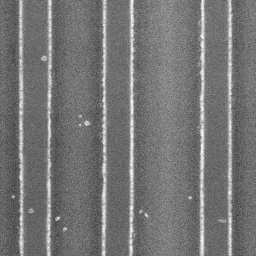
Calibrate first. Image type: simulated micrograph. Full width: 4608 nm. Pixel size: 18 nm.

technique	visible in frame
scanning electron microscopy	lines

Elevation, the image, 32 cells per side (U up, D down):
DDDUUUDDDDDDDUUUUDDDDDDDDUUUUDDD
DDDUUUDDDDDDDUUUUDDDDDDDDUUUUDDD
DDDUUUDDDDDDDUUUUDDDDDDDDUUUUDDD
DDDUUUDDDDDDDUUUUDDDDDDDDUUUUDDD
DDDUUUDDDDDDDUUUUDDDDDDDDUUUUDDD
DDDUUUDDDDDDDUUUUDDDDDDDDUUUUDDD
DDDUUUDDDDDDDUUUUDDDDDDDDUUUUDDD
DDDUUUDDDDDDDUUUUDDDDDDDDUUUUDDD
DDDUUUDDDDDDDUUUUDDDDDDDDUUUUDDD
DDDUUUDDDDDDDUUUUDDDDDDDDUUUUDDD
DDDUUUDDDDDDDUUUUDDDDDDDDUUUUDDD
DDDUUUDDDDDDDUUUUDDDDDDDDUUUUDDD
DDDUUUDDDDDDDUUUUDDDDDDDDUUUUDDD
DDDUUUDDDDDDDUUUUDDDDDDDDUUUUDDD
DDDUUUDDDDDDDUUUUDDDDDDDDUUUUDDD
DDDUUUDDDDDDDUUUUDDDDDDDDUUUUDDD
DDDUUUDDDDDDDUUUUDDDDDDDDUUUUDDD
DDDUUUDDDDDDDUUUUDDDDDDDDUUUUDDD
DDDUUUDDDDDDDUUUUDDDDDDDDUUUUDDD
DDDUUUDDDDDDDUUUUDDDDDDDDUUUUDDD
DDDUUUDDDDDDDUUUDDDDDDDDDUUUUDDD
DDDUUUDDDDDDDUUUDDDDDDDDDUUUUDDD
DDDUUUDDDDDDDUUUUDDDDDDDDUUUUDDD
DDDUUUDDDDDDDUUUUDDDDDDDDUUUUDDD
DDDUUUDDDDDDDUUUUDDDDDDDDUUUUDDD
DDDUUUDDDDDDDUUUUDDDDDDDDUUUUDDD
DDDUUUDDDDDDDUUUDDDDDDDDDUUUUDDD
DDDUUUDDDDDDDUUUDDDDDDDDDUUUUDDD
DDDUUUDDDDDDDUUUDDDDDDDDDUUUUDDD
DDDUUUDDDDDDDUUUDDDDDDDDDUUUUDDD
DDDUUUDDDDDDDUUUDDDDDDDDDUUUUDDD
DDDUUUDDDDDDDUUUDDDDDDDDDUUUUDDD